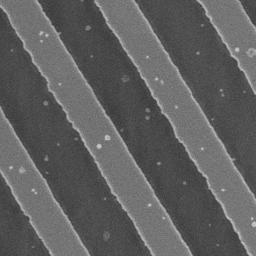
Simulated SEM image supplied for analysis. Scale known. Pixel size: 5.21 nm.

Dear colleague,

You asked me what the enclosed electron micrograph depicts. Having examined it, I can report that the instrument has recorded lines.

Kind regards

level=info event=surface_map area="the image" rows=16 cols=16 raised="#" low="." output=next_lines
###...###....##.
.##....##....###
.###...###....##
..##....###....#
...##....##....#
...###...###....
....##....##....
....###....##...
#....###...###..
##....##....##..
##....###...###.
###....##....##.
.##....###....##
..##....###...##
..###....##....#
...##....###...#